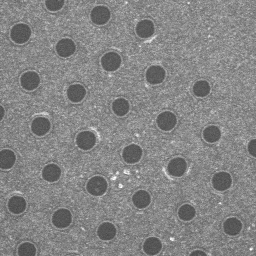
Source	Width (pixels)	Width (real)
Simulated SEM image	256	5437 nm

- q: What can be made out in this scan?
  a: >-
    a regular array of raised bodies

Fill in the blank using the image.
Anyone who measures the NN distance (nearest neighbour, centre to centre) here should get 989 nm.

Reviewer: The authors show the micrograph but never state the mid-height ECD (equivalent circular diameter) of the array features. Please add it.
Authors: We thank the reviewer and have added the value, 448 nm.